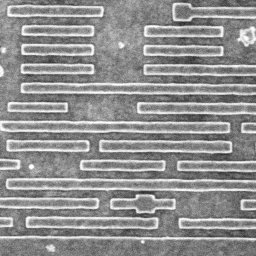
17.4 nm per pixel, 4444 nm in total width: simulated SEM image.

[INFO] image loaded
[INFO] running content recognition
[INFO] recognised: wiring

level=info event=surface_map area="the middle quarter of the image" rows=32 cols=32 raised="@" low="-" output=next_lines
@@@@@@@-------------@@@@@@@@@@@@
@@@@@@@-------------@@@@@@@@@@@@
--------------------@@@@@@@@@@@@
--------------------------------
--------------------------------
@@@@@@@@@@@@@@@@@@@@@@@@@@@@@@@@
@@@@@@@@@@@@@@@@@@@@@@@@@@@@@@@@
--------------------------------
--------------------------------
--------------------------------
@------------------@@@@@@@@@@@@@
@------------------@@@@@@@@@@@@@
--------------------------------
--------------------------------
@@-@@@@-@@----@-----------------
@@@@@@@@@@@@@@@@@@@@@@@@@@@@@@@@
@@@@@@@@@@@@@@@@@@@@@@@@@@@@@@@@
--------------------------------
--------------------------------
@@@@@@---@@@@@@@@@@@@@@@@@@--@@@
@@@@@@---@@@@@@@@@@@@@@@@@@@@@@@
@@@@@@---@@@@@@@@@@@@@@@@@@@@@@@
--------------------------------
--------------------------------
----@@@@@@@@@@@@@@@@@@@@@----@@@
----@@@@@@@@@@@@@@@@@@@@@---@@@@
---------@@@-@@@@@@@@-@@@----@@@
--------------------------------
--------------------------------
@@@@@@@@@@@@@@@@@@@@@@@@@@@@@@@@
@@@@@@@@@@@@@@@@@@@@@@@@@@@@@@@@
-------------------------------@